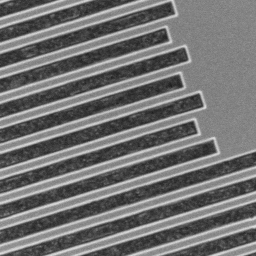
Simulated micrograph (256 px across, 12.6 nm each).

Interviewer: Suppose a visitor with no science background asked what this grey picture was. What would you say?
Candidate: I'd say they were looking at parallel lines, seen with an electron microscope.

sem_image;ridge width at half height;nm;113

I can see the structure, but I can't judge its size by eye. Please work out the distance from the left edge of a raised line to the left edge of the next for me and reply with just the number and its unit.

302 nm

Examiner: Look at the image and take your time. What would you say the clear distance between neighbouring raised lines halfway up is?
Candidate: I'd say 194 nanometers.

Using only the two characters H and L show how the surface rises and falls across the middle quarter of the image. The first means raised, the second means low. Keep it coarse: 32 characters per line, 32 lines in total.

LLLLLLLHHHHHHHLLLLLLLLLLLLLHHHHH
LLLHHHHHHHHLLLLLLLLLLLLLHHHHHHHH
HHHHHHHHLLLLLLLLLLLLLHHHHHHHHHHH
HHHHLLLLLLLLLLLLLLHHHHHHHLLLLHHH
HLLLLLLLLLLLLLHHHHHHHHLLLLLLLLHH
LLLLLLLLLLLHHHHHHHHLLLLLLLLLLLHH
LLLLLLLLHHHHHHHLLLLLLLLLLLLLHHHH
LLLLLHHHHHHLLLLLLLLLLLLLLHHHHHHH
LHHHHHHHHLLLLLLLLLLLLHHHHHHHHLLL
HHHHHHLLLLLLLLLLLLLHHHHHHHLLLLLL
HHLLLLLLLLLLLLLLHHHHHHLLLLLLLLLL
LLLLLLLLLLLLHHHHHHHLLLLLLLLLLLLL
LLLLLLLLHHHHHHHHLLLLLLLLLLLLLHHH
LLLLLHHHHHHHHLLLLLLLLLLLLLHHHHHH
LLHHHHHHHLLLLLLLLLLLLLLHHHHHHHLL
HHHHHHLLLLLLLLLLLLLHHHHHHHHLLLLL
HHHLLLLLLLLLLLLLHHHHHHHHLLLLLLLL
LLLLLLLLLLLLLHHHHHHHLLLLLLLLLLLL
LLLLLLLLLLHHHHHHHLLLLLLLLLLLLLHH
LLLLLLHHHHHHHHLLLLLLLLLLLLLHHHHH
LLLLHHHHHHHLLLLLLLLLLLLLHHHHHHHH
LHHHHHHLLLLLLLLLLLLLLHHHHHHHLLLL
HHHHLLLLLLLLLLLLLHHHHHHHHLLLLLLL
HLLLLLLLLLLLLLHHHHHHHHLLLLLLLLLL
LLLLLLLLLLLHHHHHHHLLLLLLLLLLLLLH
LLLLLLLLHHHHHHHLLLLLLLLLLLLLHHHH
LLLLHHHHHHHHLLLLLLLLLLLLLHHHHHHH
LHHHHHHHHLLLLLLLLLLLLLHHHHHHHLLL
HHHHHLLLLLLLLLLLLLLHHHHHHLLLLLLL
HHLLLLLLLLLLLLLHHHHHHHLLLLLLLLLL
LLLLLLLLLLLLHHHHHHHLLLLLLLLLLLLL
LLLLLLLLLHHHHHHHLLLLLLLLLLLLLHHH